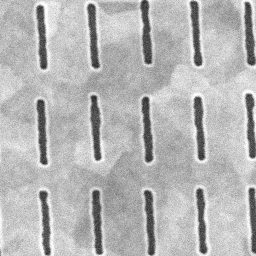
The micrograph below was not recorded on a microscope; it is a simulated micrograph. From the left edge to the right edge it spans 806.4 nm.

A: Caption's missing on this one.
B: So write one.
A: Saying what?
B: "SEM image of holes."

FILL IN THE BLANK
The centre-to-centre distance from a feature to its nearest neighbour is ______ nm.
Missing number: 163